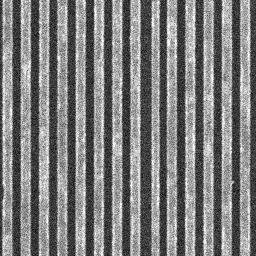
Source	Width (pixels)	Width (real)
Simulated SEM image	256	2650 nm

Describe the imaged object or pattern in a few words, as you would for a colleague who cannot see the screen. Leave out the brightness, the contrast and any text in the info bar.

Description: parallel lines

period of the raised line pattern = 189 nm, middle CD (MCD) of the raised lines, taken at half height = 91.8 nm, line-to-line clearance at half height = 0.0918 microns